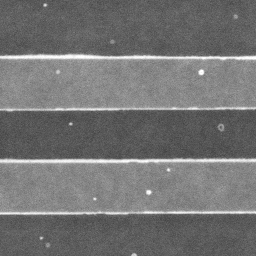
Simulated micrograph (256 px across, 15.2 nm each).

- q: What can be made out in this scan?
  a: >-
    lines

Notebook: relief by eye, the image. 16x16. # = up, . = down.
................
................
................
................
################
################
################
................
................
................
################
################
################
................
................
................